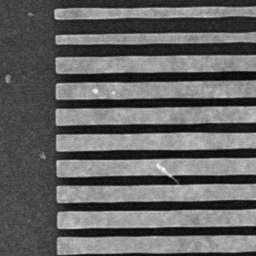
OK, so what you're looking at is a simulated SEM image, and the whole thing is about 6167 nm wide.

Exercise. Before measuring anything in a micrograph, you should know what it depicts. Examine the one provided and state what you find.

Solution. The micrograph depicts groups of lines, slits or small figures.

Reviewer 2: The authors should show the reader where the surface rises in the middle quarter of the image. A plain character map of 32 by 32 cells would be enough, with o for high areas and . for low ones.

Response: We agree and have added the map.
oooooooooooooooooooooooooooooooo
oooooooooooooooooooooooooooooooo
................................
................................
................................
oooooooooooooooooooooooooooooooo
oooooooooooooooooooooooooooooooo
oooooooooooooooooooooooooooooooo
oooooooooooooooooooooooo........
................................
................................
oooooooooooooooooooooooooooooooo
oooooooooooooooooooooooooooooooo
oooooooooooooooooooooooooooooooo
oooooooooooooooooooooooooooooooo
................................
................................
............................oooo
oooooooooooooooooooooooooooooooo
oooooooooooooooooooooooooooooooo
oooooooooooooooooooooooooooooooo
oooooooooooo....................
................................
................................
oooooooooooooooooooooooooooooooo
oooooooooooooooooooooooooooooooo
oooooooooooooooooooooooooooooooo
oooooooooooooooooooooooooooooooo
................................
................................
.................ooooooooooooooo
oooooooooooooooooooooooooooooooo